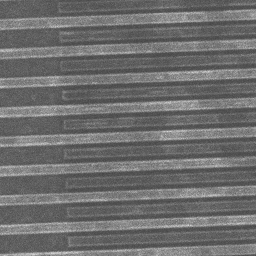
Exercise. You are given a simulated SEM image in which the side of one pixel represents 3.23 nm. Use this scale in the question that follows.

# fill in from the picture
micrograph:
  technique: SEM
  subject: parallel lines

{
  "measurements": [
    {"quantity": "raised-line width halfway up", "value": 0.0315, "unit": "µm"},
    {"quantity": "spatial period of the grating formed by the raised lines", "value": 47.3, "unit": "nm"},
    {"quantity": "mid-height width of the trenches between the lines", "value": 15.7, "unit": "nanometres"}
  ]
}